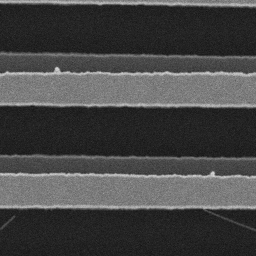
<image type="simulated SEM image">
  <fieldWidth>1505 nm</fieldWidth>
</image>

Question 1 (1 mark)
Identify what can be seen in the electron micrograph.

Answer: lines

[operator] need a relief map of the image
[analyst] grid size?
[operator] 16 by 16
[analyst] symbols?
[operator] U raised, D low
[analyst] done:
DDDDDDDDDDDDDDDD
DDDDDDDDDDDDDDDD
DDDDDDDDDDDDDDDD
UUUUUUUUUUDDDDDD
UUUUUUUUUUUUUUUU
UUUUUUUUUUUUUUUU
UUUUUUUUUUUUUUUU
DDDDDDDDDDDDDDDD
DDDDDDDDDDDDDDDD
DDDDDDDDDDDDDDDD
UUUUUUUUUUUUUUUU
UUUUUUUUUUUUUUUU
UUUUUUUUUUUUUUUU
DDDDDDDDDDDDDDDD
DDDDDDDDDDDDDDDD
DDDDDDDDDDDDDDDD